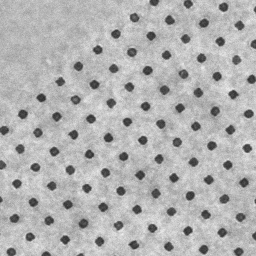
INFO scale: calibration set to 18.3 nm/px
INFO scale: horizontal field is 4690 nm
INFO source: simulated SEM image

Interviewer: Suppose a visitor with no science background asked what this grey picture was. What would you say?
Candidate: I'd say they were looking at a regular array of holes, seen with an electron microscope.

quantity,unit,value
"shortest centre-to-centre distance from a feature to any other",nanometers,440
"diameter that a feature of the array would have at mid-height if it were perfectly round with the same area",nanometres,180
